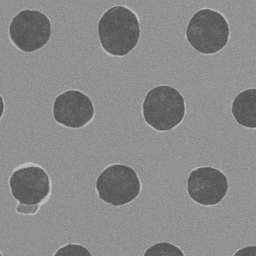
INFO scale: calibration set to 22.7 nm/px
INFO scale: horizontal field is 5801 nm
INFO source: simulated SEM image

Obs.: a regular array of holes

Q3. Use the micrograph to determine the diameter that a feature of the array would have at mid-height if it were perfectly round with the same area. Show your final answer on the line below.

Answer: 0.963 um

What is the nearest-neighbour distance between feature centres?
2 µm